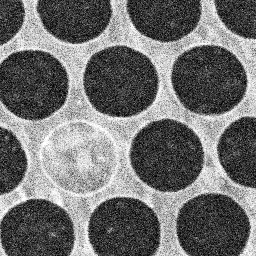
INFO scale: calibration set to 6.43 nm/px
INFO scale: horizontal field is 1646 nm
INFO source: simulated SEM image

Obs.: holes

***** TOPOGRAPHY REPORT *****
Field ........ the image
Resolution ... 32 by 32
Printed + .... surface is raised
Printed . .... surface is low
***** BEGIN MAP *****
...++.........++.........++.....
...++.........++.........++.....
...++.........++.........+++....
...++........++++.......++++....
..+++++.....++++++.....+++++++..
.++++++++.++++++++++++++++++++++
++....++++++......+++++......+++
.......++++........+++........++
........+++........+++.........+
.........+..........+..........+
.........+..........+..........+
........+++.........++.........+
........+++........+++........++
+.......++++......+++++......+++
++....+++++++....+++++++++++++++
+++++++++++++++++++....++++++...
..+++++++++++++++.......++++....
..+++++++++++++++........++.....
...+++++++++++++.........++.....
...+++++++++++++..........+.....
...+++++++++++++.........+++....
...++++++++++++++........+++....
...+++++++++++++++.......++++...
..+++++++++++++++++....++++++++.
+++++++++++++++++++++++++....+++
++.....+++++......+++++.......++
+.......++++.......+++.........+
.........++.........++.........+
.........++.........++.........+
.........++.........++.........+
.........++.........++.........+
+........+++........+++.......++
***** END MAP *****